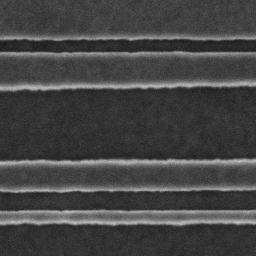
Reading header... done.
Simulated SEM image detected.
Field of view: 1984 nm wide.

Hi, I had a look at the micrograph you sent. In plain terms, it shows lines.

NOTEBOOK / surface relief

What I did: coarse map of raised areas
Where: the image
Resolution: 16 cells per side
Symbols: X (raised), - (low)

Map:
XXXXXXXXXXXXXXXX
XXXXXXXXXXXXXXXX
XXXXXXXXXXXXXXXX
XXXXXXXXXXXXXXXX
XXXXXXXXXXXXXXXX
X-X-------------
----------------
----------------
----------------
----------------
XXXXXXXXXXXXXXXX
XXXXXXXXXXXXXXXX
XXXXXXXXXXXXXXXX
XXXXXXXXXXXXXXXX
----------------
----------------